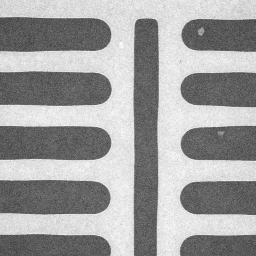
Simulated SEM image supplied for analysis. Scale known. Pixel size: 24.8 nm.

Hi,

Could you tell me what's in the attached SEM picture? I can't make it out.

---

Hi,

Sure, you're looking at groups of lines, slits or small figures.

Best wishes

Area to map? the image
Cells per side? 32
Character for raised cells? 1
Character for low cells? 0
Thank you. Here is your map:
11111111111111111111111111111111
11111111111111111111111111111111
00000000000001111001111100000000
00000000000000111000111000000000
00000000000000111000111000000000
00000000000000111000111000000000
00000111111111111000111111111000
11111111111111111000111111111111
11111111111111111000111111111111
00000000000001111000111000000000
00000000000000111000111000000000
00000000000000111000111000000000
00000000000001111000111000000000
11111111111111111000111111111111
11111111111111111000111111111111
11111111111111111000111111111111
00000000000001111000111000000000
00000000000000111000111000000000
00000000000000111000111000000000
00000000000001111000111000000000
11111111111111111000111111111111
11111111111111111000111111111111
00000000000111111000111111111111
00000000000001111000111000000000
00000000000000111000111000000000
00000000000000111000111000000000
00000000000001111000111100000000
11111111111111111000111111111111
11111111111111111000111111111111
00000000000001111000111100000000
00000000000000111000111000000000
00000000000000111000110000000000